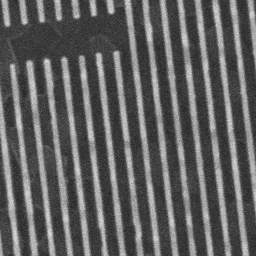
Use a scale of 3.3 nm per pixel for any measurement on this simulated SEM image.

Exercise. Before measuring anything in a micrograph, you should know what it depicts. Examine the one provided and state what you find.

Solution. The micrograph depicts parallel lines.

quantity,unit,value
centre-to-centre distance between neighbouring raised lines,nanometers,57.5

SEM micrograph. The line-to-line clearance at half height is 42.6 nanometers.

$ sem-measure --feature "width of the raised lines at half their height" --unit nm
15.1